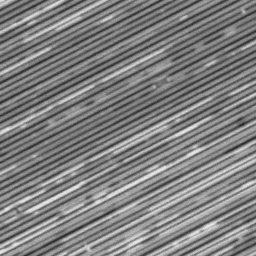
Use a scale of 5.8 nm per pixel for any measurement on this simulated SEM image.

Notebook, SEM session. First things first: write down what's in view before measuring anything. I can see parallel lines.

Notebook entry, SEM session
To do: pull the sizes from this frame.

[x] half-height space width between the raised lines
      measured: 10.9 nm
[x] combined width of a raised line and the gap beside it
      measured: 34.2 nm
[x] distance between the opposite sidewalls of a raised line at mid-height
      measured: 3.78 pixels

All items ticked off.